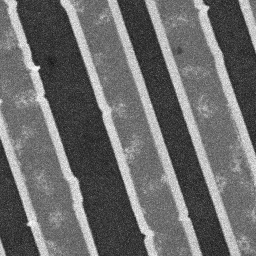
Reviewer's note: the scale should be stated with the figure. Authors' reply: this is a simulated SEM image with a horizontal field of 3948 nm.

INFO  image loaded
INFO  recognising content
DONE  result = one or a few lines or trenches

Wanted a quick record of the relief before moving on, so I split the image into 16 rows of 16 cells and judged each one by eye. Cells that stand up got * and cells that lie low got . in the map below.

*...***...***..*
*....**...***...
*....***..***...
**...***...***..
**....**...***..
**....***..***..
***...***...***.
***....**...***.
***....***..***.
.***...***...***
.***....**...***
.****...***..***
..***...***...**
..***....**...**
..***....***..**
...***...***...*